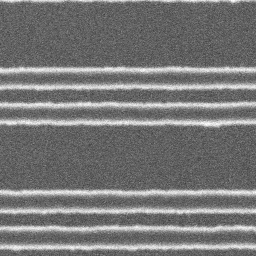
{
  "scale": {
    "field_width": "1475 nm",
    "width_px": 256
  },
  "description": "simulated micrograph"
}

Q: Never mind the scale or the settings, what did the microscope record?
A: lines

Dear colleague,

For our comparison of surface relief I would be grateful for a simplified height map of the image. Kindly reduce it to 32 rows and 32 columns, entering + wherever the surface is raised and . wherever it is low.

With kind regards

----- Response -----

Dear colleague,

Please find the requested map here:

................................
................................
................................
................................
................................
................................
................................
................................
................................
++++++++++++++++++++++++++++++++
++++++++++++++++++++++++++++++++
................................
................................
++++++++++++++++++++++++++++++++
++++++++++++++++++++++++++++++++
................................
................................
................................
................................
................................
................................
................................
................................
................................
++++++++++++++++++++++++++++++++
++++++++++++++++++++++++++++++++
.+...+........+.......++......+.
................................
++++++++++++++++++++++++++.+++++
++++++++++++++++++++++++++++++++
++++++++++++++++++++++++++++++++
................................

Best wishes